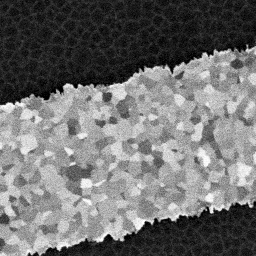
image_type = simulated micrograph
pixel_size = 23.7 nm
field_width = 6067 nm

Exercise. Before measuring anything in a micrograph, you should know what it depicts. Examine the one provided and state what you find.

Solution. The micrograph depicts one or a few lines or trenches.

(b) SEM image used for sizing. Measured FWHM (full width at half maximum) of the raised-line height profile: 3510 nanometres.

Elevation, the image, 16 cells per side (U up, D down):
DDDDDDDDDDDDDDDD
DDDDDDDDDDDDDDDD
DDDDDDDDDDDDDDDD
DDDDDDDDDDDDDUUU
DDDDDDDDDUUUUUUU
DDDDUUUUUUUUUUUU
DUUUUUUUUUUUUUUU
UUUUUUUUUUUUUUUU
UUUUUUUUUUUUUUUU
UUUUUUUUUUUUUUUU
UUUUUUUUUUUUUUUU
UUUUUUUUUUUUUUUU
UUUUUUUUUUUUUUUU
UUUUUUUUUUUDDDDD
UUUUUUUUDDDDDDDD
UUUDDDDDDDDDDDDD